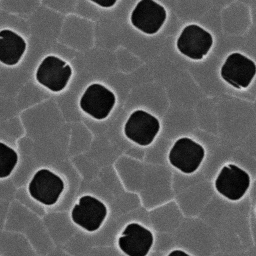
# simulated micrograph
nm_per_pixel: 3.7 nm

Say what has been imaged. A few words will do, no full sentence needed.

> a regular array of holes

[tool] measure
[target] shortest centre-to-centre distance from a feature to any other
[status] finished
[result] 191 nanometres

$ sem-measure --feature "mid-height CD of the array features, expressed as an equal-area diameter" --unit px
34.6